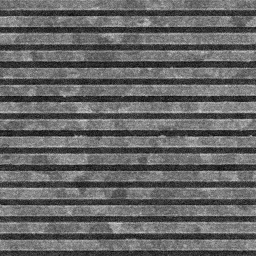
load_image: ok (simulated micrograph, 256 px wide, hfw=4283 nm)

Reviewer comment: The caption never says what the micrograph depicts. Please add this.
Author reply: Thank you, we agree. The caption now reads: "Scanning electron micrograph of parallel lines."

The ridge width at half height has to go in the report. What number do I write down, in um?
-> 0.172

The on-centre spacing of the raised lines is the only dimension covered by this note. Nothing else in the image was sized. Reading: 0.288 µm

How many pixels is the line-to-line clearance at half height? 7.38